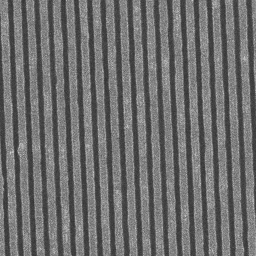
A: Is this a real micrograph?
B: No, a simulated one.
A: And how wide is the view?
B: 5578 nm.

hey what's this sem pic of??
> parallel lines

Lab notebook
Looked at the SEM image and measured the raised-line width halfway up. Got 166 nanometres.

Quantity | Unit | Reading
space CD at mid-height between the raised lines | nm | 125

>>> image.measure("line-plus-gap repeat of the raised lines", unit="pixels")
13.2